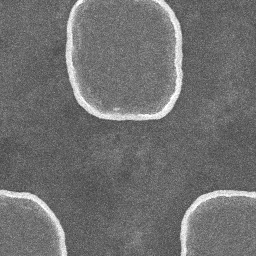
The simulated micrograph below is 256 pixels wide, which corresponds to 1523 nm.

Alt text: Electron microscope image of raised bodies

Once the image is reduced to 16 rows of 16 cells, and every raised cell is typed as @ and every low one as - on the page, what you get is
-----@@@@@------
----@@@@@@@-----
----@@@@@@@-----
----@@@@@@@-----
----@@@@@@@-----
-----@@@@@@-----
-----@@@@@@-----
----------------
----------------
----------------
----------------
----------------
@@-----------@@@
@@@---------@@@@
@@@@-------@@@@@
@@@@-------@@@@@